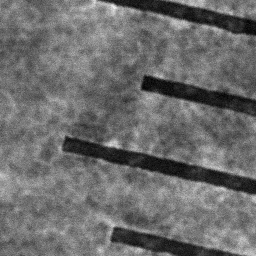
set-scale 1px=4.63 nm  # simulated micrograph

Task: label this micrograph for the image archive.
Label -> one or a few lines or trenches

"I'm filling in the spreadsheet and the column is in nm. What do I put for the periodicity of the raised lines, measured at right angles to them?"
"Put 356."